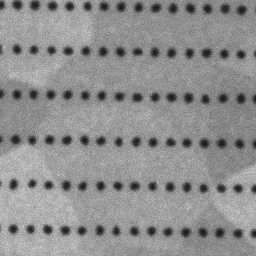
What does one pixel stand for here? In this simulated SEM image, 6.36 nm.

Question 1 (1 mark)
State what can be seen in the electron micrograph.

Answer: a regular array of holes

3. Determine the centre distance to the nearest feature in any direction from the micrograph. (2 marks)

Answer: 107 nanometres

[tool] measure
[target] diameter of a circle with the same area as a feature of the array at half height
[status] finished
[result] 0.0631 µm